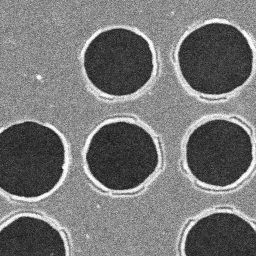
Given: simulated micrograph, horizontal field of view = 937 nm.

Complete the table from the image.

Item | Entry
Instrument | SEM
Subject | holes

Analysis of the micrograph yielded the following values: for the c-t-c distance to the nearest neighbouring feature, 343 nm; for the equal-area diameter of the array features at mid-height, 69.8 px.